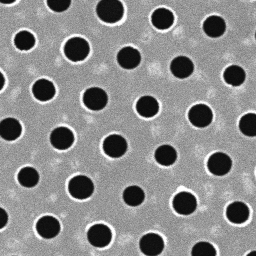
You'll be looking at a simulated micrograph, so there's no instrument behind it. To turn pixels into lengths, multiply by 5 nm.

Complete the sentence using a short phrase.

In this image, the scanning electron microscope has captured a regular array of holes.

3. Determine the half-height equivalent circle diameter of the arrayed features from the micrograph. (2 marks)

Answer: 0.113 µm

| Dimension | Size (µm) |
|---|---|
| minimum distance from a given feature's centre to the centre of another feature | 0.258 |